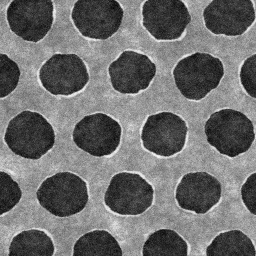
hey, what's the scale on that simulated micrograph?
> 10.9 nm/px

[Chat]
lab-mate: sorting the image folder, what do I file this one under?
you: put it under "a regular array of holes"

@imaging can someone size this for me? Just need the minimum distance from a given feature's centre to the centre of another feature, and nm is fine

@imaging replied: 722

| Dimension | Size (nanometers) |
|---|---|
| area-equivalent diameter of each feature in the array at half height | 513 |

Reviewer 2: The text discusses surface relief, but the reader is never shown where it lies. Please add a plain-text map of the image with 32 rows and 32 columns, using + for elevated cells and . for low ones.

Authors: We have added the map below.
+......++......+++.....+++......
+......++......+++......+.......
+......++......+++......+.......
+.....+++......+++.....+++.....+
++....++++....+++++....+++++++++
++++++++++++++++++++++++++++++++
+++++++++++++++..+++++++++++++++
..++++....++++.....++++....++++.
..+++......+++......++......++..
..+++......+++.....+++......++..
..+++......+++.....+++.....+++..
..++++....+++++..++++++...+++++.
++++++++++++++++++++++++.+++++++
++++++++++++++++++++++++++++++++
++...++++++...+++++...++++.....+
+.....++++.....+++.....+++......
+......++......+++.....+++......
+......++......+++.....+++......
+.....++++.....+++.....++++....+
++...+++++++..++++++.+++++++..++
++++++++++++++++++++++++++++++++
.+++++++.++++++..+++++++.+++++++
..++++....++++....+++++....++++.
..+++......++......+++......++..
...++......++......+++......++..
..+++......++......+++.....+++..
.+++++....++++....++++++..+++++.
++++++++++++++++++++++++++++++++
++++++++++++++++++++++++++++++++
++....++++....+++++....++++....+
+......++......+++.....+++......
+......++......+++......++......